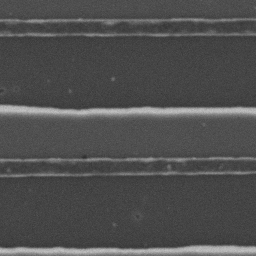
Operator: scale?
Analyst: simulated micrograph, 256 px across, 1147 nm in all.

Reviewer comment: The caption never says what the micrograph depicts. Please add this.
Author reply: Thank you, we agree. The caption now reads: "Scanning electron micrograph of lines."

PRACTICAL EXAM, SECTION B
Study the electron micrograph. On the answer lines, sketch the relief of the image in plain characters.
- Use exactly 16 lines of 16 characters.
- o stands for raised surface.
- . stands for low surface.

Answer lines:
oooooooooooooooo
oooooooooooooooo
................
................
................
................
................
oooooooooooooooo
oooooooooooooooo
oooooooooooooooo
oooooooooooooooo
................
................
................
................
................